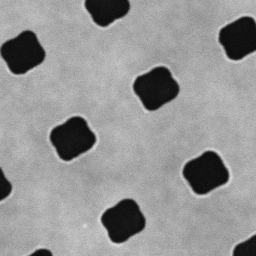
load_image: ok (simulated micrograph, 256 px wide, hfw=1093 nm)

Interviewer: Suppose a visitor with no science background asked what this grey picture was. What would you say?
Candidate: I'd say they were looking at holes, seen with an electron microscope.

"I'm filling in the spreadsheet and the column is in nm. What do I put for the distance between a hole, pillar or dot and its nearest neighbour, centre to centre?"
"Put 410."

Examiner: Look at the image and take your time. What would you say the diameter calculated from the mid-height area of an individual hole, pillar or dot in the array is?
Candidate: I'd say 177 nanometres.